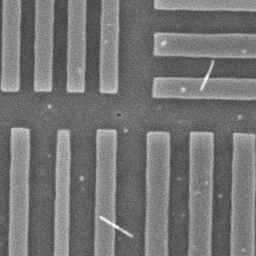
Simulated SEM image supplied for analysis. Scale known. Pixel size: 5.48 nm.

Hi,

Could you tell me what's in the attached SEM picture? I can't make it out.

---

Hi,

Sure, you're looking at groups of lines, slits or small figures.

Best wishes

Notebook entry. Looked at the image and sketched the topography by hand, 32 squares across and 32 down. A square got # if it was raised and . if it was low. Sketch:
##...##..##..##....#############
##...##..##..##.................
##...##..##..##.................
##...##..##..##.................
##...##..##..##....#############
##..###..##..##....#############
##..###.###..##....#############
##..##..###..##.................
##..##..###..##.................
##..##..##...##.................
##..##..##...##....#############
.............#.....#############
................................
................................
................................
................................
.###........##..................
.###...##...##....###...###..###
.###...##...##....###...###..###
.###...##...##....###...###..###
.###...##...##....###...###..###
.###...##...##....###...##...###
.##....##...##....###...##...###
.###...##...##....###...##...###
.###...##...##....###...##...###
.###...##...##....###...##...###
.###...##...##....###...##...###
.##....##...##....###...##...###
.##....##...##....###...##...###
.##....#....##....###...##...###
.##....#....##....###...##...###
.##....#....##....###...##...###